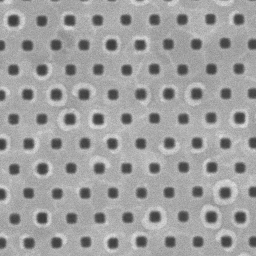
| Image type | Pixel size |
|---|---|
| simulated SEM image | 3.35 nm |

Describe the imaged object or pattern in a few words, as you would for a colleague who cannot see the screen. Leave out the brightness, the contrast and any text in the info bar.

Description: a regular array of holes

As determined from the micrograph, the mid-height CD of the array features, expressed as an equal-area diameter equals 39.8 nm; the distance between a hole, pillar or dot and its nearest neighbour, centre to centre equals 0.0926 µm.